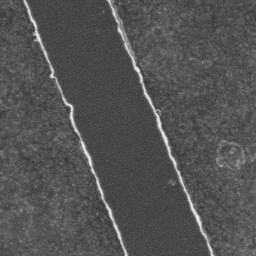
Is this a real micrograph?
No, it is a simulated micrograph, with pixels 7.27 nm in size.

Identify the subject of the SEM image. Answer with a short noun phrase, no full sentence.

one or a few lines or trenches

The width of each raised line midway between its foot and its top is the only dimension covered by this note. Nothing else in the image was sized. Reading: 0.574 microns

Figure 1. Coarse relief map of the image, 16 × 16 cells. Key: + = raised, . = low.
..+++++.........
..+++++.........
..++++++........
...+++++........
...++++++.......
....+++++.......
....+++++.......
....++++++......
.....+++++......
.....++++++.....
......+++++.....
......+++++.....
......++++++....
.......+++++....
.......++++++...
........+++++...